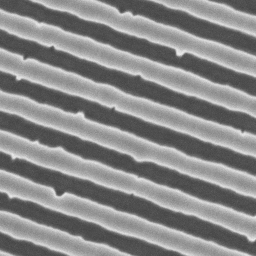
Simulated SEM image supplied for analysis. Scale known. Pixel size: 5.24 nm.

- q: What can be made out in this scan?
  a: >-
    parallel lines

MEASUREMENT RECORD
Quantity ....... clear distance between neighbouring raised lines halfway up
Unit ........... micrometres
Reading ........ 0.0979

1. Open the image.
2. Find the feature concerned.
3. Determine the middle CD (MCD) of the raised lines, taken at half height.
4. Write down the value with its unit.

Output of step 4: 19.8 pixels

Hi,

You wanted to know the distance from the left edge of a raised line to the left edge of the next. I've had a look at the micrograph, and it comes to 0.2 micrometres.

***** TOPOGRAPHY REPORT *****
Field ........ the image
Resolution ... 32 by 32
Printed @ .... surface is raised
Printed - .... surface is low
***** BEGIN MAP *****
-----@@@@@@@@-------@@@@@@@@----
@--------@@@@@@--------@@@@@@@--
@@@@-------@@@@@@@@-------@@@@@@
@@@@@@@-------@@@@@@@@-------@@@
--@@@@@@@@-------@@@@@@@--------
-----@@@@@@@@-------@@@@@@@@----
@-------@@@@@@@@------@@@@@@@@--
@@@@-------@@@@@@@@-------@@@@@@
@@@@@@@-------@@@@@@@@-------@@@
--@@@@@@@@--------@@@@@@@-------
-----@@@@@@@@-------@@@@@@@-----
--------@@@@@@@-------@@@@@@@@--
@@@@-------@@@@@@@@------@@@@@@@
@@@@@@@-------@@@@@@@-------@@@@
---@@@@@@@-------@@@@@@@--------
-----@@@@@@@-------@@@@@@@@-----
@-------@@@@@@@@-------@@@@@@@--
@@@--------@@@@@@@-------@@@@@@@
@@@@@@@@------@@@@@@@--------@@@
-@@@@@@@@@------@@@@@@@@--------
----@@@@@@@@@-------@@@@@@@-----
@-------@@@@@@@@-------@@@@@@@--
@@@@-------@@@@@@@-------@@@@@@@
@@@@@@--------@@@@@@@-------@@@@
-@@@@@@-@--------@@@@@@@-------@
-----@@@@@@@--------@@@@@@@-----
@------@@@@@@@@-------@@@@@@@@--
@@@@-------@@@@@@@-------@@@@@@@
@@@@@@@------@@@@@@@@-------@@@@
-@@@@@@@@-------@@@@@@@@-------@
-----@@@@@@@@------@@@@@@@@-----
--------@@@@@@@-------@@@@@@@@--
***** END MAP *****